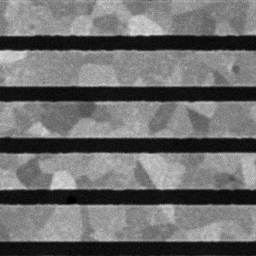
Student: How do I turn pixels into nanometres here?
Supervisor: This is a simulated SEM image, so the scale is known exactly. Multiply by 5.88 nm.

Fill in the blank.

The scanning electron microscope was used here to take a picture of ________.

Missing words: lines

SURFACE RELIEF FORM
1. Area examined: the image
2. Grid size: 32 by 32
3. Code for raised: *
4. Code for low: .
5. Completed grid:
********************************
********************************
********************************
********************************
................................
................................
********************************
********************************
********************************
********************************
********************************
................................
................................
********************************
********************************
********************************
********************************
................................
................................
********************************
********************************
********************************
********************************
********************************
................................
................................
********************************
********************************
********************************
********************************
................................
................................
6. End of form